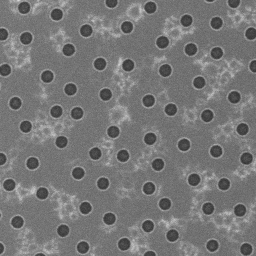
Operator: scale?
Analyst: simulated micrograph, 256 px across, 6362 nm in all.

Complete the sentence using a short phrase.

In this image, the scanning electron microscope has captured a regular array of holes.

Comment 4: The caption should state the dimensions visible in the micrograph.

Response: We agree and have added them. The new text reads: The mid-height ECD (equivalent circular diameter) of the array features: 327 nm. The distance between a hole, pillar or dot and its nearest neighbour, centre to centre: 697 nm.